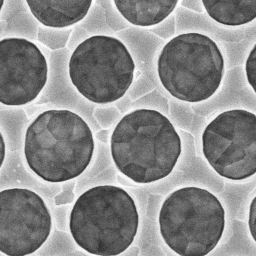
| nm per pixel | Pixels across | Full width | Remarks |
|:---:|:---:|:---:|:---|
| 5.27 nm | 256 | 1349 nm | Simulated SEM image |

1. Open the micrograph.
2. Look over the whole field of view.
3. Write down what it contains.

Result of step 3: holes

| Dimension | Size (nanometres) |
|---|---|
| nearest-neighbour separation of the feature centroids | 459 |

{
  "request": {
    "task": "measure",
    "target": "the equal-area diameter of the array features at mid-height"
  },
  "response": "366 nm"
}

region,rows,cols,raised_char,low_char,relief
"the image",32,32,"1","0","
11110000000111000000001110000000
11110000000111100000011111000000
11111000001111110000111111100000
11111111111111111111111111111111
11111111111101111111110000111111
00001111110000011111100000011111
00000111100000001111000000001110
00000011100000000111000000001110
00000011100000000111000000001110
00000011100000000111000000001110
00000011100000001111000000011110
00000111110000001111100000011111
00001111111000011111111000111111
11111111111111111111111111111111
11111000001111110000111111100000
11110000000111100000011111000000
11100000000111000000001111000000
11100000000011000000000110000000
01100000000011000000000110000000
01100000000111000000001111000000
11110000000111000000001111000000
11110000001111100000011111100000
11111100111111111000111111111111
11111111111100011111111001111111
00000111110000001111100000011111
00000011100000000111000000001110
00000011100000000111000000001110
00000011100000000111000000001110
00000011100000000111000000001110
00000011100000000111000000001110
00000111110000001111100000011111
00001111111000011111110000111111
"